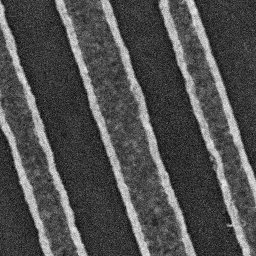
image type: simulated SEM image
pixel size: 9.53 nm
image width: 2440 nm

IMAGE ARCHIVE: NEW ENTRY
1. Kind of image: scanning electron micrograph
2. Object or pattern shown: one or a few lines or trenches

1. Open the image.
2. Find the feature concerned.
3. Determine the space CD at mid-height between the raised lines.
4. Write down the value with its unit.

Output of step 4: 539 nm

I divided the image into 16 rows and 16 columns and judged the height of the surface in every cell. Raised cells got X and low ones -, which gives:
----XXX---XX----
----XXX----X----
X----XX----XX---
X----XXX---XX---
X----XXX----XX--
XX----XXX---XX--
XX----XXX---XX--
XX----XXX----X--
-XX----XX----XX-
-XX----XXX---XX-
-XX----XXX----X-
--XX----XX----XX
--XX----XXX---XX
--XX----XXX----X
---XX----XXX---X
---XX----XXX---X